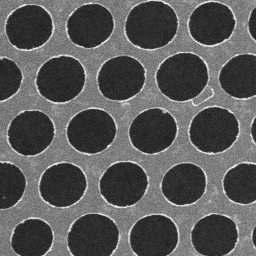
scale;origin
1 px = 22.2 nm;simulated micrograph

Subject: a regular array of holes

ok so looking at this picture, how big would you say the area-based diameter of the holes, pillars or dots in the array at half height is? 1.03 micrometres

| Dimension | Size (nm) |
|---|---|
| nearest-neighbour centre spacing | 1330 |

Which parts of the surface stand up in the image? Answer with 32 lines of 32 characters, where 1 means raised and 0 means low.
11111111111011111000011110001111
11000011100000110000001100000110
10000001000000110000001100000110
10000001000000110000001100000110
10000011100000110000001100000110
10000111100001111000011110011111
11111111111111111111111111111111
01111100001111000111100001111000
00111000001110000011000000110000
00011000000100000010000000100000
00011000000100000011000000110000
00111000001110000111000000110000
01111100011111001111110000111111
11111111111111111110111111001111
11000011100000111000001100000111
10000001100000110000001100000011
10000001000000010000001100000010
10000001000000110000001100000111
11000011100001111000011110000111
11111111111111111111111111111111
00111110011111000111110011111100
00011100001110000011100001110000
00011000000110000011000000110000
00011000000110000011000000110000
00011000001110000011100001110000
00111100011111000111110011111101
11111111111111111111111111111111
11100111110000111000011110000111
11000011100000011000001100000011
11000001000000010000001100000011
10000011000000010000001100000111
11000011100000111000001110000111